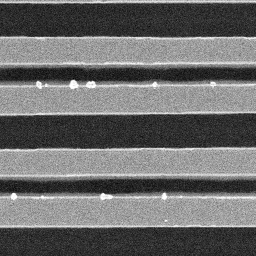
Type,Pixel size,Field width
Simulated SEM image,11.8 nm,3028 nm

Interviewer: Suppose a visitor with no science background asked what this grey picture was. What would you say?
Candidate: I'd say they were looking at lines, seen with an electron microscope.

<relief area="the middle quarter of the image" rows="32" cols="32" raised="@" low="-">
--------------------------------
--------------------------------
--------------------------------
--------------------------------
--@---@-------------------------
@@@@@@@@@@@@@@@@@@@@@@@@@@@@@@@@
@@@@@@@@@@@@@@@@@@@@@@@@@@@@@@@@
@@@@@@@@@@@@@@@@@@@@@@@@@@@@@@@@
@@@@@@@@@@@@@@@@@@@@@@@@@@@@@@@@
@@@@@@@@@@@@@@@@@@@@@@@@@@@@@@@@
@@@@@@@@@@@@@@@@@@@@@@@@@@@@@@@@
@@@@@@@@@@@@@@@@@@@@@@@@@@@@@@@@
--------------------------------
--------------------------------
--------------------------------
--------------------------------
--------------------------------
--------------------------------
--------------------------------
--------------------------------
--------------------------------
@@@@@@@@@@@@@@@@@@@@@@@@@@@@@@@@
@@@@@@@@@@@@@@@@@@@@@@@@@@@@@@@@
@@@@@@@@@@@@@@@@@@@@@@@@@@@@@@@@
@@@@@@@@@@@@@@@@@@@@@@@@@@@@@@@@
@@@@@@@@@@@@@@@@@@@@@@@@@@@@@@@@
@@@@@@@@@@@@@@@@@@@@@@@@@@@@@@@@
@@@@@@@@@@@@@@@@@@@@@@@@@@@@@@@@
--------------------------------
--------------------------------
--------------------------------
--------------------------------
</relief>